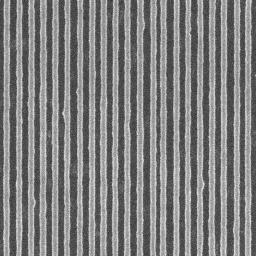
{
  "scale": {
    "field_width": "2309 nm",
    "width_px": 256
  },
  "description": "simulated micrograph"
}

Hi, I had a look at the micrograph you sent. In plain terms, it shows parallel lines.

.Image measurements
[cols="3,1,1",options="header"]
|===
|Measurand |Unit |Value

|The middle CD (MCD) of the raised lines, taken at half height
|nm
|49.6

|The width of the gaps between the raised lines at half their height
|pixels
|6.75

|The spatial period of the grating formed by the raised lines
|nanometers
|109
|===